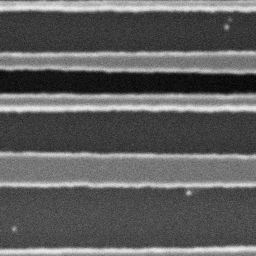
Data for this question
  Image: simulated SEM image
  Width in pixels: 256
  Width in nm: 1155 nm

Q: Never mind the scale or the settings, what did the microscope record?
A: lines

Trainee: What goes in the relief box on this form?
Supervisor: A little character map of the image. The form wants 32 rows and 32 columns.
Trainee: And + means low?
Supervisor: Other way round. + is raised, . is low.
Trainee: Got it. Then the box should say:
++++++++++++++++++++++++++++++++
................................
................................
................................
................................
................................
............................++++
++++++++++++++++++++++++++++++++
++++++++++++++++++++++++++++++++
................................
................................
................................
++++++++++++++++++++++++++++++++
++++++++++++++++++++++++++++++++
................................
................................
................................
................................
................................
++++++++++++++++++++++++++++++++
++++++++++++++++++++++++++++++++
++++++++++++++++++++++++++++++++
++++++++++++++++++++++++++++++++
................................
................................
................................
................................
................................
................................
................................
................................
.+++++++++++++++++++++++++++++++